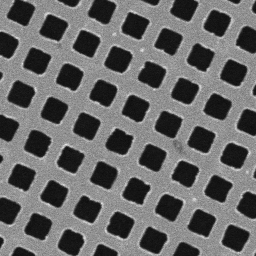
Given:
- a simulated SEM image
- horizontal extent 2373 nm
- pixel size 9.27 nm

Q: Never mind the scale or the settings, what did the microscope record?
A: a regular array of holes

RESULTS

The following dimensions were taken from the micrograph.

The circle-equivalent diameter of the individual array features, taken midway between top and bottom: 234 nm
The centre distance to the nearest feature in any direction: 0.337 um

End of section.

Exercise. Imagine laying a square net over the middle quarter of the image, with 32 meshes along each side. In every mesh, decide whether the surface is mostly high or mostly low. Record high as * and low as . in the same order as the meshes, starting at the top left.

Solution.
..********......****....********
....********....***......*******
.....**************......*******
.....*************.......****.**
....****...********.....****....
....***......********...****....
**.****......**************.....
******.......**************.....
******.......***...********.....
********....****.....********...
.*********.****......***********
.**************......***********
****..********......****...*****
****....********....****.....***
***......*********.****.......**
***......**************......***
**.......****..********......***
***.....****....********....****
*****..****......*********..***.
***********......**************.
**********.......****..********.
...********.....****.....*******
.....*********.****.......******
.....**************......*******
.....****.*********......****..*
....****....********....****....
...****......*********..****....
*******......**************.....
*******......****.*********.....
*******.....****....********....
*********...****.....*********..
.**************.......**********